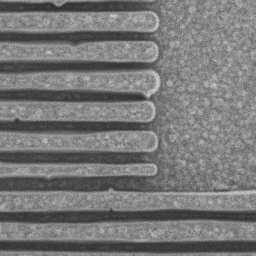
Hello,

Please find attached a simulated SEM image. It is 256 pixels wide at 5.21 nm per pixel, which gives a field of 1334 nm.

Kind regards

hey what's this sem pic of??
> parallel lines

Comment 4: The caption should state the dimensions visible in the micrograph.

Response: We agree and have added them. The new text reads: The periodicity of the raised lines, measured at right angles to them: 156 nanometres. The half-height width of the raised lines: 19 pixels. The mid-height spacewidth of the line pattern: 59.2 nm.